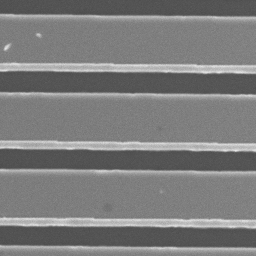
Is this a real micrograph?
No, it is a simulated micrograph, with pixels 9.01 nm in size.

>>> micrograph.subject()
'lines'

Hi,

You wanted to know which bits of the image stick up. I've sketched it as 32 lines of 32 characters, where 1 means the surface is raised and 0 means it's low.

00000000000000000000000000000000
00000000000000000000000000000000
11111111111111111111111111111111
11111111111111111111111111111111
11111111111111111111111111111111
11111111111111111111111111111111
11111111111111111111111111111111
11111111111111111111111111111111
11111111111111111111111111111111
00000000000000000000000000000000
00000000000000000000000000000000
00000000000000000000000000000000
11111111111111111111111111111111
11111111111111111111111111111111
11111111111111111111111111111111
11111111111111111111111111111111
11111111111111111111111111111111
11111111111111111111111111111111
11111111111111111111111111111111
00000000000000000000000000000000
00000000000000000000000000000000
11111111111111111111111110000000
11111111111111111111111111111111
11111111111111111111111111111111
11111111111111111111111111111111
11111111111111111111111111111111
11111111111111111111111111111111
11111111111111111111111111111111
00000000000000000000000000000000
00000000000000000000000000000000
00000000000000000000000000000000
11111111111111111111111111111111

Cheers